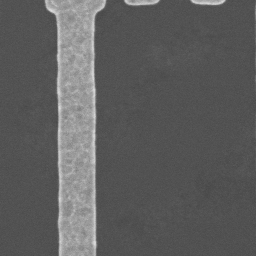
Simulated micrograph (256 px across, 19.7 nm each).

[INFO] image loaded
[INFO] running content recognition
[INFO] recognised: wiring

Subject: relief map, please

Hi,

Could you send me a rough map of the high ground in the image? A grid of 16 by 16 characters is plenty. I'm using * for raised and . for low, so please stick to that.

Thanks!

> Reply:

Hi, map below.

...***..........
....**..........
....**..........
....**..........
....**..........
....**..........
....**..........
....**..........
....**..........
....**..........
....**..........
....**..........
....**..........
....**..........
....**..........
....**..........